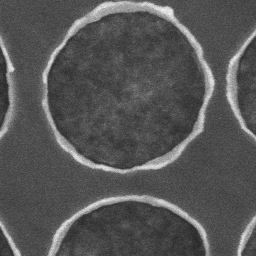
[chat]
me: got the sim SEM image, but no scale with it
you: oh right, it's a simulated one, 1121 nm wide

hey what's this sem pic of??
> holes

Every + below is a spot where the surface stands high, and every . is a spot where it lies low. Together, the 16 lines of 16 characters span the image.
++++++++++++++++
+++++......+++++
++++........++++
+++.........+++.
+++..........++.
+++..........++.
.++..........++.
+++.........+++.
++++........++++
+++++......+++++
+++++++.++++++++
++++++++++++++++
++++++++++++++++
+++++......+++++
++++........++++
.+++.........++.